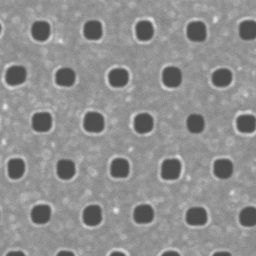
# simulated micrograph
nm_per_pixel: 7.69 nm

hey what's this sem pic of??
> a regular array of holes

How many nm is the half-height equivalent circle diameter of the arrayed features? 160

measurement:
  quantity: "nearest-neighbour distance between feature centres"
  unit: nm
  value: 392